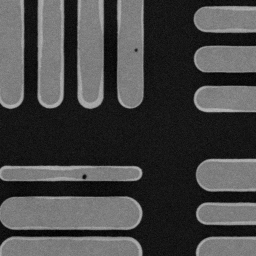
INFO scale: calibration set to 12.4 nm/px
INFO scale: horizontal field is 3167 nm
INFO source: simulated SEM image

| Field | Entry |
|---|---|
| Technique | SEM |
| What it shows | groups of lines, slits or small figures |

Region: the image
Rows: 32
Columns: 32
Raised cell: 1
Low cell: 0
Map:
11100111001110011100000000000000
11100111001110011100000001111111
11100111001110011100000011111111
11100111001110011100000001111111
11100111001110011100000000000000
11100111001110011100000000000000
11100111001110011100000001111111
11100111001110011100000011111111
11100111001110011100000001111111
11100111001110011100000000000000
11100111001110011100000000000000
11100111001110011100000001111111
11100111001100011100000011111111
00000000000000000000000001111111
00000000000000000000000000000000
00000000000000000000000000000000
00000000000000000000000000000000
00000000000000000000000000000000
00000000000000000000000000000000
00000000000000000000000000000000
00000000000000000000000001111111
11111111111111111100000001111111
01111100001111111000000001111111
00000000000000000000000001111111
00000000000000000000000000000000
11111111111111111000000000000000
11111111111111111100000001111111
11111111111111111000000001111111
01111111111111110000000000000000
00000000000000000000000000000000
11111111111111111000000001111111
11111111111111111100000001111111